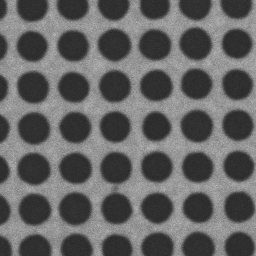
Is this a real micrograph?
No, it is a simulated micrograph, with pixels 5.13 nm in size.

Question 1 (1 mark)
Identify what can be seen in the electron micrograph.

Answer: a regular array of holes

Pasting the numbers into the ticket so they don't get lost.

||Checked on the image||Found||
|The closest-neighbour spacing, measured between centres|40.5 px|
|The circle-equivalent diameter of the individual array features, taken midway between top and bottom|158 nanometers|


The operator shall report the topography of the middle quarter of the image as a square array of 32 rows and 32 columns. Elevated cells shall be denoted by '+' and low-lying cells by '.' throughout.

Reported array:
++++++++++++++++++++++++++++++++
++++++++++++++++++++++..+++++++.
+...++++++.....+++++......++++..
.....++++.......++++......+++...
......+++.......+++........++...
......+++........++........++...
......+++........++........+++..
......+++.......++++.......+++..
.....+++++.....++++++.....+++++.
++..++++++++.+++++++++++++++++++
++++++++++++++++++++++++++++++++
++++++++++++++++++++++++++++++++
+....++++++....++++++....++++++.
......++++......++++......++++..
......+++.......++++......+++...
.......++........+++......+++...
.......++........+++.......++...
......++++......++++......++++..
.....+++++......+++++....++++++.
++..++++++++..++++++++++++++++++
++++++++++++++++++++++++++++++++
++++++++++++++++++++++++++++++++
++..+++++++....++++++....++++++.
......++++......++++......++++..
.......++........+++.......+++..
.......++........++........+++..
.......++........++........+++..
.......++........+++.......+++..
......++++......++++......+++++.
++...++++++....++++++++.++++++++
++++++++++++++++++++++++++++++++
++++++++++++++++++++++++++++++++